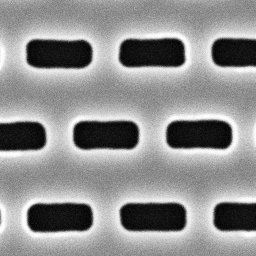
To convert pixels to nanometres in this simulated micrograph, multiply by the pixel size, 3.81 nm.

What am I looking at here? holes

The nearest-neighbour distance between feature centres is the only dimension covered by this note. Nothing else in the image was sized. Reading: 357 nanometres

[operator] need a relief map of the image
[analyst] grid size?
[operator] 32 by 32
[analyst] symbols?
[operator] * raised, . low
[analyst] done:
********************************
********************************
********************************
********************************
********************************
***........****........****.....
***.........***........***......
***.........***........****.....
****.......*****.****.******...*
********************************
********************************
********************************
********************************
********************************
********************************
.....****........****........***
......***........****........***
......***........****........***
.....*****.......****.......****
********************************
********************************
********************************
********************************
********************************
********************************
****.......*****.......****.....
***.........***........****.....
***.........***........****.....
****.......****........****.....
********************************
********************************
********************************